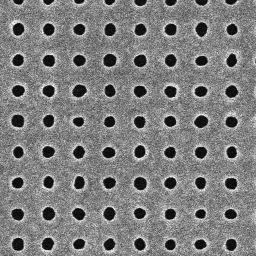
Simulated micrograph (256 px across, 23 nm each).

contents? a regular array of holes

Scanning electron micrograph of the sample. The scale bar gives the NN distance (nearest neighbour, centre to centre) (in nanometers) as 690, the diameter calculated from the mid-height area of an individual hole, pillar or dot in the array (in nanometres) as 280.